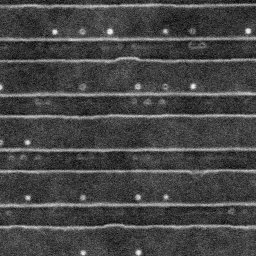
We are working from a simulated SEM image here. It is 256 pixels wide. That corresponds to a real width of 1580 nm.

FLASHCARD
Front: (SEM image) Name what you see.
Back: wiring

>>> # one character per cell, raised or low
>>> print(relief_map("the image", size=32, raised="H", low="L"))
LLLLLLLLLLLLLLLLLLLLLLLLLLLLLLLL
HHHHHHHHHHHHHHHHHHHHHHHHHHHHHHHH
HHHHHHHHHHHHHHHHHHHHHHHHHHHHHHHH
HHHHHHHHHHHHHHHHHHHHHHHHHHHHHHHH
HHHHHHHHHHHHHHHHHHHHHHHHHHHHHHHH
LLLLLLLLLLLLLLLLLLLLLLLLLLLLLLLL
LLLLLLLLLLLLLLLLLLLLLLLLLLLLLLLL
LLLLLLLLLLLLLLHHHHLLLLLLLLLLLLHH
HHHHHHHHHHHHHHHHHHHHHHHHHHHHHHHH
HHHHHHHHHHHHHHHHHHHHHHHHHHHHHHHH
HHHHHHHHHHHHHHHHHHHHHHHHHHHHHHHH
HHHHHHHHHHHHHHHHHHHHHHHHHHHHHHHH
LLLLLLLLLLLLLLLLLLLLLLLLLLLLLLLL
LLLLLLLLLLLLLLLLLLLLLLLLLLLLLLLL
LLLLLLLLLLLLLHHHHHHHHHHHHHHHHHHL
HHHHHHHHHHHHHHHHHHHHHHHHHHHHHHHH
HHHHHHHHHHHHHHHHHHHHHHHHHHHHHHHH
HHHHHHHHHHHHHHHHHHHHHHHHHHHHHHHH
HHHHHHHHHHHHHHHHHHHHHHHHHHHHHHHH
LLLLLLLLLLLLLLLLLLLLLLLLLLLLLLLL
LLLLLLLLLLLLLLLLLLLLLLLLLLLLLLLL
HHHHHHHHHHHHHHHHHHHHHHHHLHHHHHHH
HHHHHHHHHHHHHHHHHHHHHHHHHHHHHHHH
HHHHHHHHHHHHHHHHHHHHHHHHHHHHHHHH
HHHHHHHHHHHHHHHHHHHHHHHHHHHHHHHH
HHHHHHHHHHHHHHHHHHHHHHHHHHHHHHHH
LLLLLLLLLLLLLLLLLLLLLLLLLLLLLLLL
LLLLLLLLLLLLLLLLLLLLLLLLLLLLLLLL
HHHHHHHLLLHHHHHHHHHHHHHHHHHHHHHH
HHHHHHHHHHHHHHHHHHHHHHHHHHHHHHHH
HHHHHHHHHHHHHHHHHHHHHHHHHHHHHHHH
HHHHHHHHHHHHHHHHHHHHHHHHHHHHHHHH